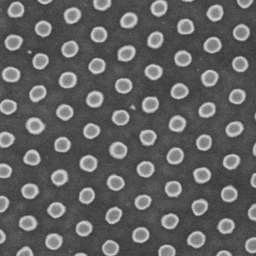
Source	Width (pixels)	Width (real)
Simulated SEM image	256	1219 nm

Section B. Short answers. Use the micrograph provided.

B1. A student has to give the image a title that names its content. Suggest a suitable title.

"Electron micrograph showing a regular array of raised bodies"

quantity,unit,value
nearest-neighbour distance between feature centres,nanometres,152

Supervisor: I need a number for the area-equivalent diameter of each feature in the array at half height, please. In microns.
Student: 0.0748